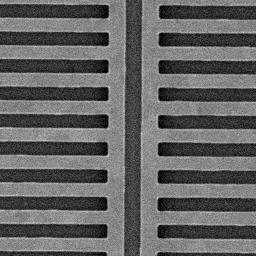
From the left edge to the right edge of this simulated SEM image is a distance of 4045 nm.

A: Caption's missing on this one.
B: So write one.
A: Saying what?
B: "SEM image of groups of lines, slits or small figures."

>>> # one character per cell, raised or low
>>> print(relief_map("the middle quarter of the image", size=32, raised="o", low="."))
...........oooo.....ooo.........
...........oooo.....ooo.........
...........oooo.....oooo........
ooooooooooooooo.....oooooooooooo
ooooooooooooooo.....oooooooooooo
ooooooooooooooo.....oooooooooooo
...........oooo.....ooo.........
...........oooo.....ooo.........
...........oooo.....ooo.........
ooooooooooooooo.....ooooo.oooo..
ooooooooooooooo.....oooooooooooo
ooooooooooooooo.....oooooooooooo
...........oooo.....oooo.oooooo.
...........oooo.....ooo.........
...........oooo....oooo.........
...........oooo....oooo.........
ooooooooooooooo....oooooooo.....
ooooooooooooooo....ooooooooooooo
ooooooooooooooo....ooooooooooooo
..........ooooo....ooooo........
...........oooo....oooo.........
...........oooo....oooo.........
...........oooo....oooo.........
ooooooooooooooo....ooooooooooooo
ooooooooooooooo....ooooooooooooo
ooooooooooooooo....ooooooooooooo
...........oooo....ooooo........
...........oooo....oooo.........
...........oooo....oooo.........
...........oooo....oooo.........
ooooooooooooooo....ooooooooooooo
ooooooooooooooo....ooooooooooooo